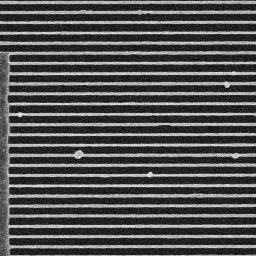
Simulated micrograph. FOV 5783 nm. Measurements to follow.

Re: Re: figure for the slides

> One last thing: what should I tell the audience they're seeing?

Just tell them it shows parallel lines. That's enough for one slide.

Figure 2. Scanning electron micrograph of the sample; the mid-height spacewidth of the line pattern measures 164 nanometers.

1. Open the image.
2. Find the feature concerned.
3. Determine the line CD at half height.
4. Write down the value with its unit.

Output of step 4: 2.75 px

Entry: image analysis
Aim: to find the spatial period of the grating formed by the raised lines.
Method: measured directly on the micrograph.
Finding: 230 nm